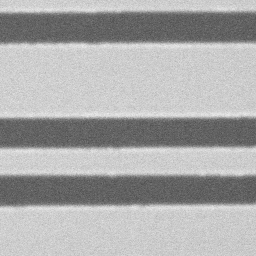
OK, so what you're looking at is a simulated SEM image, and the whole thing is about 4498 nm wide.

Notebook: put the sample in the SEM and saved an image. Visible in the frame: lines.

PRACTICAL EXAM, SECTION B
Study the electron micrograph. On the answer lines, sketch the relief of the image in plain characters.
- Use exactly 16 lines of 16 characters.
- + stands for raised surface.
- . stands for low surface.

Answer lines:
++++++++++++++++
................
................
++++++++++++++++
++++++++++++++++
++++++++++++++++
++++++++++++++++
................
................
++++++++++++++++
++++++++++++++++
................
................
++++++++++++++++
++++++++++++++++
++++++++++++++++